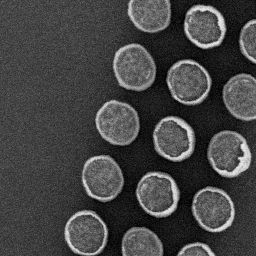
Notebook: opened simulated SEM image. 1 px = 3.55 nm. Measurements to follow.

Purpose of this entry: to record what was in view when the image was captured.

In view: a regular array of raised bodies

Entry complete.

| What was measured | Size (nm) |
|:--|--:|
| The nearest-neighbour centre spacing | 203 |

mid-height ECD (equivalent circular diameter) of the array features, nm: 151